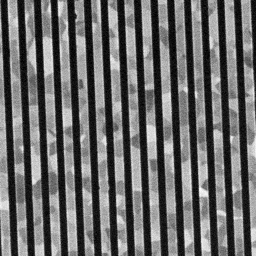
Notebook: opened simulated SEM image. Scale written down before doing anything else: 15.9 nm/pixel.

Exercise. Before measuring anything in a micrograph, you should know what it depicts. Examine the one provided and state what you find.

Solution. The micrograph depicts parallel lines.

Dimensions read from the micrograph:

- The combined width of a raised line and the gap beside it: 0.264 microns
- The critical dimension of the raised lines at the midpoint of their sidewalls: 131 nm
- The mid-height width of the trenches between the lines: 131 nanometers